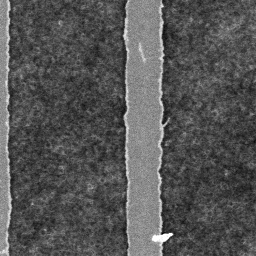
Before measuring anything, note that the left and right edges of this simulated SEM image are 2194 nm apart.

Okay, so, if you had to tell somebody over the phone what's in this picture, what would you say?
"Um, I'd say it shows one or a few lines or trenches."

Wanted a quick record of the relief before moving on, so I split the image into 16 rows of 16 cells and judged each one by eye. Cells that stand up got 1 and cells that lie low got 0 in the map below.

1000000011000000
1000000011000000
1000000011000000
1000000011000000
1000000011000000
0000000011000000
0000000011000000
1000000011000000
1000000011000000
0000000011000000
1000000011000000
1000000011000000
1000000011000000
1000000011000000
0000000011000000
1000000011000000